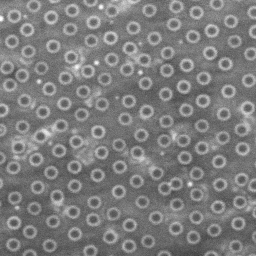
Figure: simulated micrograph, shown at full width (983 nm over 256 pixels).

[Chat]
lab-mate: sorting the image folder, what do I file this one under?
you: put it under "a regular array of raised bodies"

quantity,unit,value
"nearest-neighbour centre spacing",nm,76.4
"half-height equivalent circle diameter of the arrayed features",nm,46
